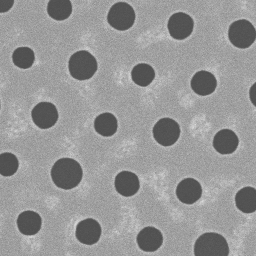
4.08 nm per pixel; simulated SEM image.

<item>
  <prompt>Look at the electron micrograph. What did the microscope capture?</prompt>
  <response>a regular array of holes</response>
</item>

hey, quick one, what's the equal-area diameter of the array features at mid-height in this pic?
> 104 nm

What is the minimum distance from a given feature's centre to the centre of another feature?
245 nm